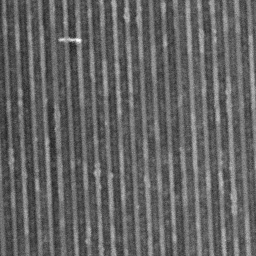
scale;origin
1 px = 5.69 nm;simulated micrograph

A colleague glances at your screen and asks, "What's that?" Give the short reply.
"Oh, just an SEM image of parallel lines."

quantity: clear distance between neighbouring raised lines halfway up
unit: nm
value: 49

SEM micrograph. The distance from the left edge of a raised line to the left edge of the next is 69.7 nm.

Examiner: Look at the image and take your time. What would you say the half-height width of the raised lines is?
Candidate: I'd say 22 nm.